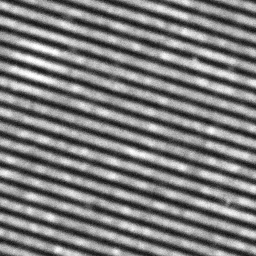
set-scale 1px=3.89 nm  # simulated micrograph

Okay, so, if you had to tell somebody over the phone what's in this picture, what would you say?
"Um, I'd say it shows parallel lines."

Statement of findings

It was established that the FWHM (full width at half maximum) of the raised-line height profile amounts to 27.4 nm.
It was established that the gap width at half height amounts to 0.0306 microns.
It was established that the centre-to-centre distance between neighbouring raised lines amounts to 0.0563 micrometres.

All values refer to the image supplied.